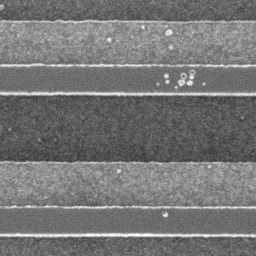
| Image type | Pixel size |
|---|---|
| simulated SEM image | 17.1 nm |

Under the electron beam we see lines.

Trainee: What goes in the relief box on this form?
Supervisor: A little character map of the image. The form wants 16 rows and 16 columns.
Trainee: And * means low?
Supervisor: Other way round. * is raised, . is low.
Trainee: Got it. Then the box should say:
................
****************
****************
****************
****************
****************
................
................
................
................
****************
****************
****************
****************
****************
................